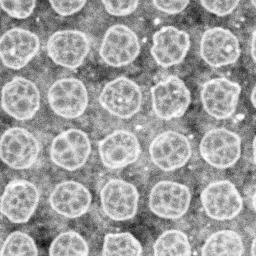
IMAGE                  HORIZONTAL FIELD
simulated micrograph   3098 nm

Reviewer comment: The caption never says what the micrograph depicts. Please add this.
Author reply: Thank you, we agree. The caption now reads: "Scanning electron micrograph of a regular array of raised bodies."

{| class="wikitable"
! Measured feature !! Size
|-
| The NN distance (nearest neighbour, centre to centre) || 593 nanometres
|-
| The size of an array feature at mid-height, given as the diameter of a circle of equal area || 452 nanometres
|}